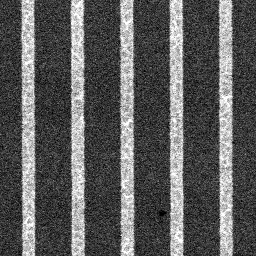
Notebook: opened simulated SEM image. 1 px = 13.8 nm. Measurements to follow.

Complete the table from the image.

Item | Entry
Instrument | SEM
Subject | parallel lines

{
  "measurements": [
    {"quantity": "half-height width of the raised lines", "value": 158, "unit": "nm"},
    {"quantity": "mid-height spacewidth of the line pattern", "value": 523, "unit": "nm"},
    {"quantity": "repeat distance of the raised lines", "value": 0.684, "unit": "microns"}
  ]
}